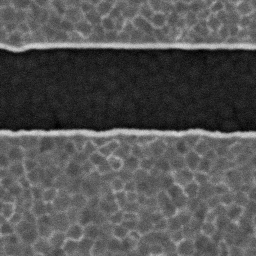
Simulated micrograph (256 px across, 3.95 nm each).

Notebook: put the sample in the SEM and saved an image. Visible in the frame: one or a few lines or trenches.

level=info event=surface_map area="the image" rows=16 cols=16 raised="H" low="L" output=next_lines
HHHHHHHHHHHHHHHH
HHHHHHHHHHHHHHHH
HHHHHHHHHHHHHHHH
LLLLLLLLLLLLLLLL
LLLLLLLLLLLLLLLL
LLLLLLLLLLLLLLLL
LLLLLLLLLLLLLLLL
LLLLLLLLLLLLLLLL
HHHHHHHHHHHHHHHH
HHHHHHHHHHHHHHHH
HHHHHHHHHHHHHHHH
HHHHHHHHHHHHHHHH
HHHHHHHHHHHHHHHH
HHHHHHHHHHHHHHHH
HHHHHHHHHHHHHHHH
HHHHHHHHHHHHHHHH